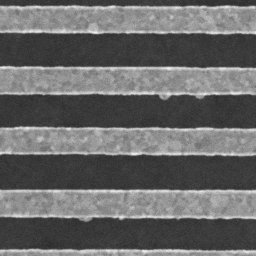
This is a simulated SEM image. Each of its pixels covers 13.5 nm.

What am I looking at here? lines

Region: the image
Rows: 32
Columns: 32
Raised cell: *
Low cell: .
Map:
................................
********************************
********************************
********************************
................................
................................
................................
................................
**************.****..*..........
********************************
********************************
********************************
................................
................................
................................
................................
********************************
********************************
********************************
................................
................................
................................
................................
................................
********************************
********************************
********************************
................................
................................
................................
................................
*******************************.